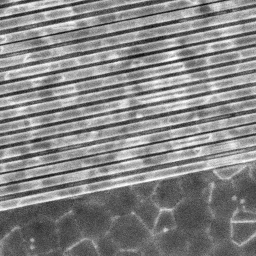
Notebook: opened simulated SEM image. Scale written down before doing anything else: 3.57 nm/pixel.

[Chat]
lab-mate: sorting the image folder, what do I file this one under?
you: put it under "parallel lines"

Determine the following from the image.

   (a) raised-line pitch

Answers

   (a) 45.1 nm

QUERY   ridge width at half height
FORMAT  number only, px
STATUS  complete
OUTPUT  8.71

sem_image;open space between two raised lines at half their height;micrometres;0.0154